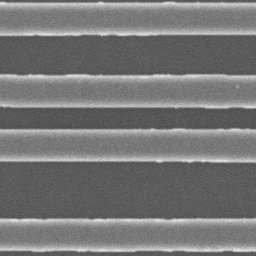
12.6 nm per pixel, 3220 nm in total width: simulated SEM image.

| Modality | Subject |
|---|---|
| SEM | lines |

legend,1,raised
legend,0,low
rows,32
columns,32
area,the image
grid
11111111111111111111111111111111
11111111111111111111111111111111
11111111111111111111111111111111
11111111111111111111111111111111
00000000000000000000000000000000
00000000000000000000000000000000
00000000000000000000000000000000
00000000000000000000000000000000
00000000000000000000000000000000
11011100111100000001110111111000
11111111111111111111111111111111
11111111111111111111111111111111
11111111111111111111111111111111
00000000000000000000000000000000
00000000000000000000000000000000
00000000000000000000000000000000
11111111111111111111111111111111
11111111111111111111111111111111
11111111111111111111111111111111
11111111111111111111111111111111
00000000000000000000000000000000
00000000000000000000000000000000
00000000000000000000000000000000
00000000000000000000000000000000
00000000000000000000000000000000
00000000000000000000000000000000
00000000000000000000000000000000
11111111111111111111111111111111
11111111111111111111111111111111
11111111111111111111111111111111
11111111111111111111111111111111
00000000000000000000000000000000